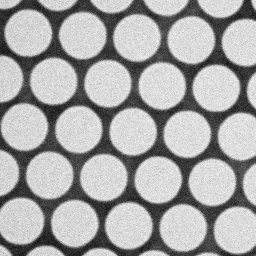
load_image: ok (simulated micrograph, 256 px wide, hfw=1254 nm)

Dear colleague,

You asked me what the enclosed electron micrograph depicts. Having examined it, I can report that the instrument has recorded an array of small figures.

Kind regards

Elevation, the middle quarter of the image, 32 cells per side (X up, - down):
XX-----XXXXXXX--------XXXXX-----
XX----XXXXXXXXXX----XXXXXXXXX---
XXX---XXXXXXXXXX---XXXXXXXXXXX--
XXX--XXXXXXXXXXX---XXXXXXXXXXX--
XXX--XXXXXXXXXXXX--XXXXXXXXXXX--
XXX--XXXXXXXXXXXX--XXXXXXXXXXX--
XXX---XXXXXXXXXX---XXXXXXXXXXX--
XX----XXXXXXXXXX---XXXXXXXXXXX--
X------XXXXXXXX-----XXXXXXXXX---
--------XXXXXX------XXXXXXXXX---
----------XX----------XXXXX-----
-XXXXXX---------XXX-------------
XXXXXXXX------XXXXXXX-------XXXX
XXXXXXXXX----XXXXXXXXX-----XXXXX
XXXXXXXXX---XXXXXXXXXX----XXXXXX
XXXXXXXXX---XXXXXXXXXXX--XXXXXXX
XXXXXXXXX---XXXXXXXXXXX--XXXXXXX
XXXXXXXXX---XXXXXXXXXXX--XXXXXXX
XXXXXXXXX---XXXXXXXXXXX--XXXXXXX
XXXXXXXX----XXXXXXXXXX---XXXXXXX
XXXXXXXX-----XXXXXXXXX----XXXXXX
-XXXXX--------XXXXXXX------XXXXX
----------------XXX---------XXXX
-------XXXXXX---------XXX-------
X-----XXXXXXXX------XXXXXXX-----
XX---XXXXXXXXXX----XXXXXXXXX----
XX--XXXXXXXXXXX---XXXXXXXXXXX---
XX--XXXXXXXXXXXX--XXXXXXXXXXX---
XX--XXXXXXXXXXXX--XXXXXXXXXXX--X
XX--XXXXXXXXXXX---XXXXXXXXXXX--X
X----XXXXXXXXXX---XXXXXXXXXXX--X
X----XXXXXXXXXX---XXXXXXXXXXX---